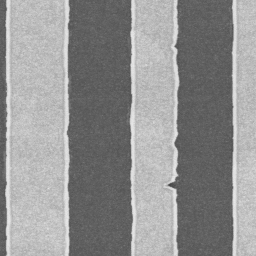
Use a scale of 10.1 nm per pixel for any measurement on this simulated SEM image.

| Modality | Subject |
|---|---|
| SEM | one or a few lines or trenches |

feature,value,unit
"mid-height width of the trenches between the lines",646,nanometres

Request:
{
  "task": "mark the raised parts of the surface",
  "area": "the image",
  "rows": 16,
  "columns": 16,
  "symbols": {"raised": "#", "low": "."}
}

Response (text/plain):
.###....###....#
####....###....#
####....###....#
####....###....#
####....###....#
.###....###....#
.###....###....#
.###....###....#
####....###....#
.###....###....#
.###....###....#
####....###....#
####....###....#
.###....###....#
.###....###....#
.###....###....#